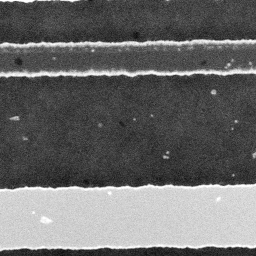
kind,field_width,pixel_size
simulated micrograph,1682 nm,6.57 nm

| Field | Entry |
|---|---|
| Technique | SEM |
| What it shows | lines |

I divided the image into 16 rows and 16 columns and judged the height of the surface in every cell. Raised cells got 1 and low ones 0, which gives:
0000000000000000
0000000000000000
0000000000000000
1111111111111111
1111111111111111
0000000000000000
0000000000000000
0000000000000000
0000000000000000
0000000000000000
0000000000000000
0000000000000000
1111111111111111
1111111111111111
1111111111111111
1111110100000000